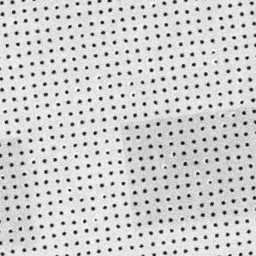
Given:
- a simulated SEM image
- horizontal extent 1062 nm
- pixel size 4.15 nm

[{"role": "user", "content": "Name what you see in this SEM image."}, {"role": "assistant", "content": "a regular array of holes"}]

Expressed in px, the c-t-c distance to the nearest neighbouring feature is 10.1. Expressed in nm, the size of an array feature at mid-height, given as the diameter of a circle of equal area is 16.9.